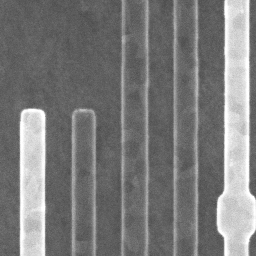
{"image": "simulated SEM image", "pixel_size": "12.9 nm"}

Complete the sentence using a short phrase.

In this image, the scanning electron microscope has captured wiring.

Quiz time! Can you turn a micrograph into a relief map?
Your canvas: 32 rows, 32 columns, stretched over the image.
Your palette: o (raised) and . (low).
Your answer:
...............ooo....ooo...ooo.
...............ooo....ooo...ooo.
...............ooo....ooo...ooo.
...............ooo....ooo...ooo.
...............ooo....ooo...ooo.
...............ooo....ooo...ooo.
...............ooo....ooo...ooo.
...............ooo....ooo...ooo.
...............ooo....ooo...ooo.
...............ooo....ooo...ooo.
...............ooo....ooo...ooo.
...............ooo....ooo...ooo.
...............ooo....ooo...ooo.
...............ooo....ooo...ooo.
...oo....ooo...ooo....ooo...ooo.
...ooo...ooo...ooo....ooo...ooo.
...oo....ooo...ooo....ooo...ooo.
...oo....ooo...ooo....ooo...ooo.
...ooo...ooo...ooo....ooo...ooo.
...ooo...ooo...ooo....ooo...ooo.
...oo....ooo...ooo....ooo...ooo.
...oo....ooo...ooo....ooo...ooo.
...oo....ooo...ooo....ooo...ooo.
...oo....ooo...ooo....ooo...ooo.
...oo....ooo...ooo....ooo...ooo.
...oo....ooo...ooo....ooo..ooooo
...oo....ooo...ooo....ooo..ooooo
...oo....ooo...ooo....ooo..ooooo
...oo....ooo...ooo....ooo..ooooo
...oo....ooo...ooo....ooo...ooo.
...oo....ooo...ooo....ooo...ooo.
...oo....ooo...ooo....ooo...ooo.